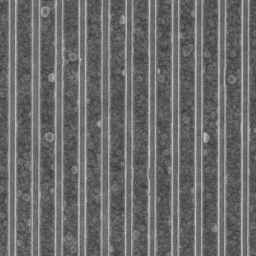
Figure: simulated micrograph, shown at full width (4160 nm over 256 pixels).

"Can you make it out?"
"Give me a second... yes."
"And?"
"parallel lines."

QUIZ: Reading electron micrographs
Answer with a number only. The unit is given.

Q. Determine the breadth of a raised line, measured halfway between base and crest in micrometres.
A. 0.28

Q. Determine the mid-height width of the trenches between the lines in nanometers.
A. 97.5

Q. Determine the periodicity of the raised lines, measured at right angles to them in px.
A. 23.2